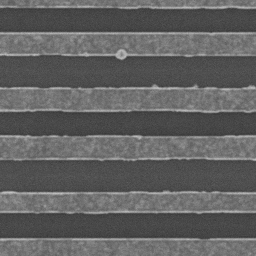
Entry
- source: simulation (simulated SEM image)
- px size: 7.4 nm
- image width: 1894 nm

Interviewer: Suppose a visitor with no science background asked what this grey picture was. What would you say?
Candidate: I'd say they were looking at lines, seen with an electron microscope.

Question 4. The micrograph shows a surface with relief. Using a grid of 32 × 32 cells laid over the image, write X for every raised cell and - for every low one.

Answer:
XXXXXXXXXXXXXXXXXXXXXXXXXXXXXXXX
--------------------------------
--------------------------------
--------------------------------
XXXXXXXXXXXXXXXXXXXXXXXXXXXXXXXX
XXXXXXXXXXXXXXXXXXXXXXXXXXXXXXXX
XXXXXXXXXXXXXXXXXXXXXXXXXXXXXXXX
--------------------------------
--------------------------------
--------------------------------
--------------------------------
XXXXXXXXXXXXXXXXXXXXXXXXXXXXXXXX
XXXXXXXXXXXXXXXXXXXXXXXXXXXXXXXX
XXXXXXXXXXXXXXXXXXXXXXXXXXXXXXXX
--------------------------------
--------------------------------
--------------------------------
XXXXXXXXXXXXXXXXXXXXXXXXXXXXXXXX
XXXXXXXXXXXXXXXXXXXXXXXXXXXXXXXX
XXXXXXXXXXXXXXXXXXXXXXXXXXXXXXXX
--------------------------------
--------------------------------
--------------------------------
--------------------------------
XXXXXXXXXXXXXXXXXXXXXXXXXXXXXXXX
XXXXXXXXXXXXXXXXXXXXXXXXXXXXXXXX
XXXXXXXXXXXXXXXXXXXXXXXXXXXXXXXX
--------------------------------
--------------------------------
--------------------------------
XXXXXXXXXXXXXXXXXXXXXXXXXXXXXXXX
XXXXXXXXXXXXXXXXXXXXXXXXXXXXXXXX